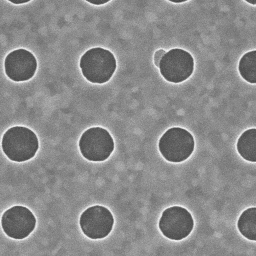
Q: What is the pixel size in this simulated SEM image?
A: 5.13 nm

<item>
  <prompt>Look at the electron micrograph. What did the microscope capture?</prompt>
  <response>a regular array of holes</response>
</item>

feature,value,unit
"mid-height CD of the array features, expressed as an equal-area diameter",182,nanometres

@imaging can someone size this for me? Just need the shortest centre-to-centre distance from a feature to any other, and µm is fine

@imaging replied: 0.398